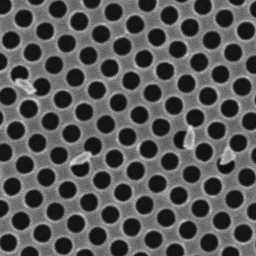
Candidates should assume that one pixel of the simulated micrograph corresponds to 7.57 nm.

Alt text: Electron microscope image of a regular array of holes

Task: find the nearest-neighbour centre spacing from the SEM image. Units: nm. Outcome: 187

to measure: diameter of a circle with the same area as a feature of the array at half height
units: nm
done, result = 138